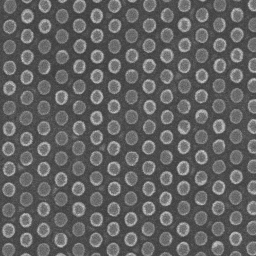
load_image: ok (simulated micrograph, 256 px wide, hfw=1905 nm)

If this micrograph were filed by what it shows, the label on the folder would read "a regular array of raised bodies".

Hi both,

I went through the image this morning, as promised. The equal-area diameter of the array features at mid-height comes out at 98.6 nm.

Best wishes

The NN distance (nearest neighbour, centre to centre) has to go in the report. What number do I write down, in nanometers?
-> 147